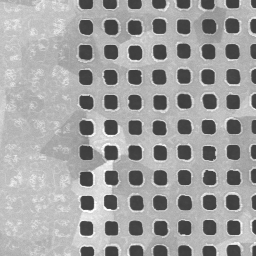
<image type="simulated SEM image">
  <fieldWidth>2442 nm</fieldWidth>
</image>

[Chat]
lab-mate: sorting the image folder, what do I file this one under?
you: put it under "a regular array of holes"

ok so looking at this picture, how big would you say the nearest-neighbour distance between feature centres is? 24.1 pixels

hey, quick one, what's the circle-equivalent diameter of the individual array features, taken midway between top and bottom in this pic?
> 0.144 µm